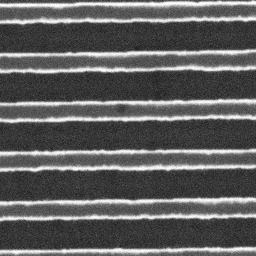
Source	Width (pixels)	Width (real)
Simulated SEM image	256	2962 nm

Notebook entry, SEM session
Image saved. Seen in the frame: lines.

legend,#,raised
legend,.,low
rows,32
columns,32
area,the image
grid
.........#######################
################################
########################...#....
................................
................................
................................
.........................#######
################################
################################
................................
................................
................................
................................
################################
################################
................................
................................
................................
................................
################################
################################
................................
................................
................................
................................
################################
################################
#...............................
................................
................................
................................
################################